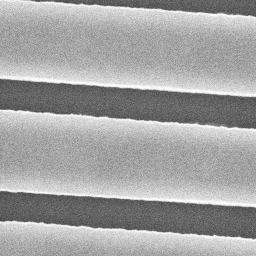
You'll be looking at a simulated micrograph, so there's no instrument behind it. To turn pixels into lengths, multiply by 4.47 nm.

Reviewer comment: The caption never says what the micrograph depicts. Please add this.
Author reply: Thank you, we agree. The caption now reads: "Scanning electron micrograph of lines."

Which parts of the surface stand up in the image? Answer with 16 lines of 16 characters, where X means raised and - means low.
XXXXXXXX--------
XXXXXXXXXXXXXXXX
XXXXXXXXXXXXXXXX
XXXXXXXXXXXXXXXX
XXXXXXXXXXXXXXXX
--------XXXXXXXX
----------------
XXXXXXXX--------
XXXXXXXXXXXXXXXX
XXXXXXXXXXXXXXXX
XXXXXXXXXXXXXXXX
XXXXXXXXXXXXXXXX
---------XXXXXXX
----------------
XXXXXXXXXX------
XXXXXXXXXXXXXXXX